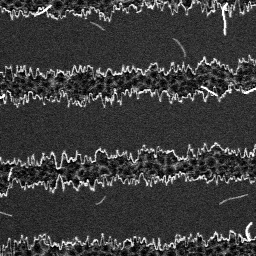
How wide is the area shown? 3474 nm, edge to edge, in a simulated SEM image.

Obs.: one or a few lines or trenches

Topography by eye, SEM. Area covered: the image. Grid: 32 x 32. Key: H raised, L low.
HHHHHHHHHHHHHHHHHHHHHHHHLHHHHLHH
LHHHHLHHHHHLHHLLLLLLLLLLLLLLLLLL
LLLLLLLLLLLLLLLLLLLLLLLLLLLLLLLL
LLLLLLLLLLLLLLLLLLLLLLLLLLLLLLLL
LLLLLLLLLLLLLLLLLLLLLLLLLLLLLLLL
LLLLLLLLLLLLLLLLLLLLLLLLLLLLLLLL
LLLLLLLLLLLLLLLLLLLLLLLLLLLLLLLL
LLLLLLLLLLLLLLLLLLLLLLLLLLLLLLLL
LLLLLLLLLLLLLLLLLLLHLHHHLHHHLLHH
HHHHHHHHHHHHHHHHHHHHHHHHHHHHHHHH
HHHHHHHHHHHHHHHHHHHHHHHHHHHHHHHH
HHHHHHHHHHHHHHHHHHLHHHHHHHHHLLLL
LLHLLHLLLHHLLHLLLLLLLLLLLLLLLLLL
LLLLLLLLLLLLLLLLLLLLLLLLLLLLLLLL
LLLLLLLLLLLLLLLLLLLLLLLLLLLLLLLL
LLLLLLLLLLLLLLLLLLLLLLLLLLLLLLLL
LLLLLLLLLLLLLLLLLLLLLLLLLLLLLLLL
LLLLLLLLLLLLLLLLLLLLLLLLLLLLLLLL
LLLLLLLLLLLLLLLLLLLLLLLLLLHHLLLL
LLLLLLHLLLLLHHHHLHHHHHLHHHHHHHHH
HHHHHHHLHHHHHHHHHHHHHHHHHHHHHHHH
HHHHHHHHHHHHHHHHHHHHHHHHHHHHHHHH
HHHHHHHHHHHHHHLHHLHLHLLLLLLLHLLH
HLLLLLHLLLLLLLLLLLLLLLLLLLLLLLLL
LLLLLLLLLLLLLLLLLLLLLLLLLLLLLLLL
LLLLLLLLLLLLLLLLLLLLLLLLLLLLLLLL
LLLLLLLLLLLLLLLLLLLLLLLLLLLLLLLL
LLLLLLLLLLLLLLLLLLLLLLLLLLLLLLLL
LLLLLLLLLLLLLLLLLLLLLLLLLLLLLLLL
LLLLLLLLLLLLLLLLLLLLLLLLLLLLLHLL
LLHHHHHLHHHHHHLHHHHLLLHHHHHHHHHH
HHHHHHHHHHHHHHHHHHHHHHHHHHHHHHHH